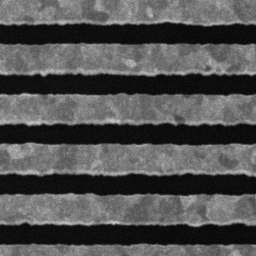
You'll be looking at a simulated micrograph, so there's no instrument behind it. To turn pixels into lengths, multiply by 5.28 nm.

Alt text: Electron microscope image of lines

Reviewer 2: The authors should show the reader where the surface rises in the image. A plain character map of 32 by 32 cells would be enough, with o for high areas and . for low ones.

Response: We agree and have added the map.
oooooooooooooooooooooooooooooooo
oooooooooooooooooooooooooooooooo
oooooooooooooooooooooooooooooooo
................................
................................
..........o.....................
oooooooooooooooooooooooooooooooo
oooooooooooooooooooooooooooooooo
oooooooooooooooooooooooooooooooo
................................
................................
................................
oooooooooooooooooooooooooooooooo
oooooooooooooooooooooooooooooooo
oooooooooooooooooooooooooooooooo
...oo.o.oo......oo.o...oo.o.oo..
................................
................................
oooooooooooooooooooooooooooooooo
oooooooooooooooooooooooooooooooo
oooooooooooooooooooooooooooooooo
oooooooooooooooooooooooooooooooo
................................
................................
oooooooooooooooooooooooooooooooo
oooooooooooooooooooooooooooooooo
oooooooooooooooooooooooooooooooo
oooooooooooooooooooooooooooooooo
................................
................................
................................
oooooooooooooooooooooooooooooooo